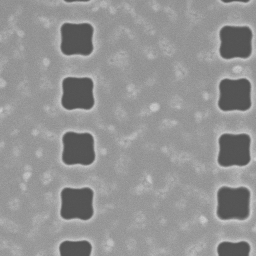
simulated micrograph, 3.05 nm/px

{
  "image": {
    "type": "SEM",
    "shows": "a regular array of holes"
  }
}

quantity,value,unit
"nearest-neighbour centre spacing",164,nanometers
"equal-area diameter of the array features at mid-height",0.106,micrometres